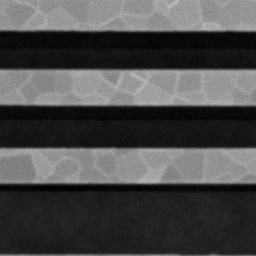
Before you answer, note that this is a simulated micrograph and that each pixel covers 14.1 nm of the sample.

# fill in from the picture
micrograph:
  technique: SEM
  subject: lines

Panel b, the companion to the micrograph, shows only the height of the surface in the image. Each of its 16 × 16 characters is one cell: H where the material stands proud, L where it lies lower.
HHHHHHHHHHHHHHHH
HHHHHHHHHHHHHHHH
LLLLLLLLLLLLLLLL
LLLLLLLLLLLLLLLL
HHHHHHHHHHHHHHHH
HHHHHHHHHHHHHHHH
HHHHHHHHHHHHHHHH
LLLLLLLLLLLLLLLL
LLLLLLLLLLLLLLLL
HHHHHHHHHHHHHHHH
HHHHHHHHHHHHHHHH
LLLLLLLLLLLLLLLL
LLLLLLLLLLLLLLLL
LLLLLLLLLLLLLLLL
LLLLLLLLLLLLLLLL
LLLLLLLLLLLLLLLL